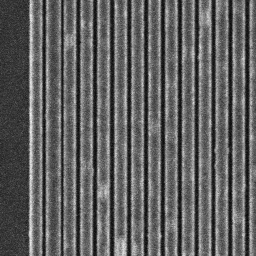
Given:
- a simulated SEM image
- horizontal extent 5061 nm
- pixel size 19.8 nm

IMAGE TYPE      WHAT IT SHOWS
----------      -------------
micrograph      parallel lines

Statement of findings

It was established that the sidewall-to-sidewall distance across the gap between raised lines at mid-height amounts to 0.0939 µm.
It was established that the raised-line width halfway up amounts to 0.237 micrometres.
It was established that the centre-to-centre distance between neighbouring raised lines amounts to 334 nm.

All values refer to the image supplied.